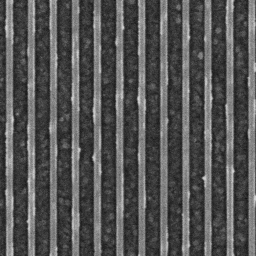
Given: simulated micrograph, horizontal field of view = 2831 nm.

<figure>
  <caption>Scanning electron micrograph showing parallel lines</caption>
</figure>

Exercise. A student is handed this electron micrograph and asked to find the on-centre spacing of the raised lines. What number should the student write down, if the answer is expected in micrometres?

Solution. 0.243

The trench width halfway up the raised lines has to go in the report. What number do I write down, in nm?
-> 171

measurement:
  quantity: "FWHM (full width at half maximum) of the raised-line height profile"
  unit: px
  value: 6